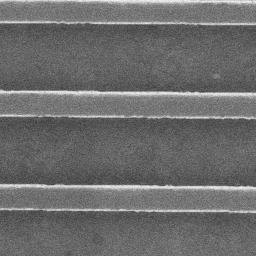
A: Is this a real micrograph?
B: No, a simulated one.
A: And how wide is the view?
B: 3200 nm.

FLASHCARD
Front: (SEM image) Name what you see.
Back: lines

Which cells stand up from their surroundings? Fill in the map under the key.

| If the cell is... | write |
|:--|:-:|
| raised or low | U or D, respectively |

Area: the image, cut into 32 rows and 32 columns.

UUUUUUUUUUUUUUUUUUUUUUUUUUUUUUUU
UUUUUUUUUUUUUUUUUUUUUUUUUUUUUUUU
UUUUUUUUUUUUUUUUUUUUUUUUUUUUUUUU
DDDDDDDDDDDDDDDDDDDDDDDDDDDDDDDD
DDDDDDDDDDDDDDDDDDDDDDDDDDDDDDDD
DDDDDDDDDDDDDDDDDDDDDDDDDDDDDDDD
DDDDDDDDDDDDDDDDDDDDDDDDDDDDDDDD
DDDDDDDDDDDDDDDDDDDDDDDDDDDDDDDD
DDDDDDDDDDDDDDDDDDDDDDDDDDDDDDDD
DDDDDDDDDDDDDDDDDDDDDDDDDDDDDDDD
DDDDDDDDDDDDDDDDDDDDDDDDDDDDDDDD
UUUUUUUUUDDDDDDDDDDDDDDDDDDDDDDD
UUUUUUUUUUUUUUUUUUUUUUUUUUUUUUUU
UUUUUUUUUUUUUUUUUUUUUUUUUUUUUUUU
DDDDDDDDDUUUUUUUUUUUUUUUUUUUUUUU
DDDDDDDDDDDDDDDDDDDDDDDDDDDDDDDD
DDDDDDDDDDDDDDDDDDDDDDDDDDDDDDDD
DDDDDDDDDDDDDDDDDDDDDDDDDDDDDDDD
DDDDDDDDDDDDDDDDDDDDDDDDDDDDDDDD
DDDDDDDDDDDDDDDDDDDDDDDDDDDDDDDD
DDDDDDDDDDDDDDDDDDDDDDDDDDDDDDDD
DDDDDDDDDDDDDDDDDDDDDDDDDDDDDDDD
DDDDDDDDDDDDDDDDDDDDDDDDDDDDDDDD
UUUUUUUUUUUUUUUUUUUUUUUUUUUUUUUU
UUUUUUUUUUUUUUUUUUUUUUUUUUUUUUUU
UUUUUUUUUUUUUUUUUUUUUUUUUUUUUUUU
DDDDDDDDDDDDDDDDDDDDDDDDDDDDDDUU
DDDDDDDDDDDDDDDDDDDDDDDDDDDDDDDD
DDDDDDDDDDDDDDDDDDDDDDDDDDDDDDDD
DDDDDDDDDDDDDDDDDDDDDDDDDDDDDDDD
DDDDDDDDDDDDDDDDDDDDDDDDDDDDDDDD
DDDDDDDDDDDDDDDDDDDDDDDDDDDDDDDD